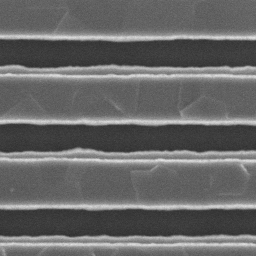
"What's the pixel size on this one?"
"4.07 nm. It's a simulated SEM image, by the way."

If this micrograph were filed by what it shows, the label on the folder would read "lines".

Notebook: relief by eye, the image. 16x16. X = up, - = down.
XXXXXXXXXXXXXXXX
XXXXXXXXXXXXXXXX
----------------
----------------
----------------
XXXXXXXXXXXXXXXX
XXXXXXXXXXXXXXXX
XXXXXXXXXXXXXXXX
----------------
----------------
XXXXXXXXXXXXXXXX
XXXXXXXXXXXXXXXX
XXXXXXXXXXXXXXXX
----------------
----------------
XXXXXXXXXXXXXXXX